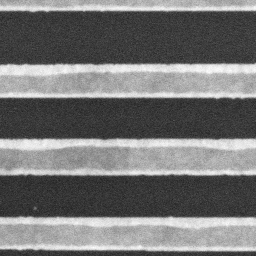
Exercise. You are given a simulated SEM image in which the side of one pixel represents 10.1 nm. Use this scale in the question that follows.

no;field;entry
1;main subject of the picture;lines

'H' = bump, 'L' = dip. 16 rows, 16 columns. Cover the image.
HHHHHHHHHHHHHHHH
LLLLLLLLLLLLLLLL
LLLLLLLLLLLLLLLL
LLLLLLLLLLLLLLLL
HHHHHHHHHHHHHHHH
HHHHHHHHHHHHHHHH
LLLLLLLLLLLLLLLL
LLLLLLLLLLLLLLLL
LLLLLLLLLLLLLLLL
HHHHHHHHHHHHHHHH
HHHHHHHHHHHHHHHH
LLLLLLLLLLLLLLLL
LLLLLLLLLLLLLLLL
LLLLLLLLLLLLLLLL
HHHHHHHHHHHHHHHH
HHHHHHHHHHHHHHHH